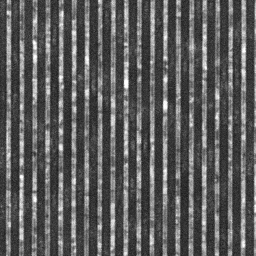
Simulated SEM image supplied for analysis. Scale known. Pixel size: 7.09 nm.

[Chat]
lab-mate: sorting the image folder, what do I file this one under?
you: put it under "parallel lines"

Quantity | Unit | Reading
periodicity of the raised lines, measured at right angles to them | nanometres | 92.4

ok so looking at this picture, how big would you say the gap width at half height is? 69.1 nm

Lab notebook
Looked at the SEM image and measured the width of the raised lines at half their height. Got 21.3 nanometers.